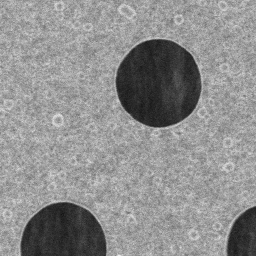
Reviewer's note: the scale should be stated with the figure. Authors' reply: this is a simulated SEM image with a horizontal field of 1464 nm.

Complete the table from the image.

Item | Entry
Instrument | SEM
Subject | holes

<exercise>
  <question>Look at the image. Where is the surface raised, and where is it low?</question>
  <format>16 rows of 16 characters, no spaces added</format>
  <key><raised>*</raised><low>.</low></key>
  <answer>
****************
****************
****************
********....****
*******.....****
*******......***
********....****
*********..*****
****************
****************
****************
****************
****************
**....*********.
*.....********..
*......*******..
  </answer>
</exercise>